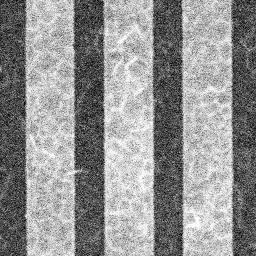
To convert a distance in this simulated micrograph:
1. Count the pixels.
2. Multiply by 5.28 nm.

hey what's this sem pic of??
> one or a few lines or trenches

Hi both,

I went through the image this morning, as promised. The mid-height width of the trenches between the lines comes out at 163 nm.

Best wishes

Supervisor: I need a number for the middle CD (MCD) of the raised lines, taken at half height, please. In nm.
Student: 250